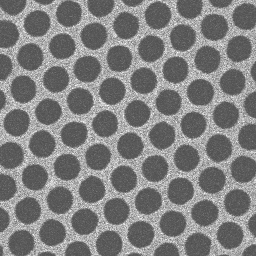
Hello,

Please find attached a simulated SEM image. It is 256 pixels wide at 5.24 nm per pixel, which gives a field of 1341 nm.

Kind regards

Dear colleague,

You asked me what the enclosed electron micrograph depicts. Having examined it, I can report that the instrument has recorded a regular array of holes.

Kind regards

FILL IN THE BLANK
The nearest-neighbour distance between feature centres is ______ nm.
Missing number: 173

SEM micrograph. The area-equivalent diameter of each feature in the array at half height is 141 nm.